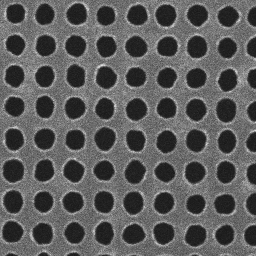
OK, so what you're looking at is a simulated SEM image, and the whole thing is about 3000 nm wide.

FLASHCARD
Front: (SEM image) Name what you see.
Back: a regular array of holes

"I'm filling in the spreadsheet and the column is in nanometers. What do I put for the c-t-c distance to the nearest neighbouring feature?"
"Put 350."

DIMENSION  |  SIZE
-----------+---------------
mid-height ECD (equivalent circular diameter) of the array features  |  246 nm